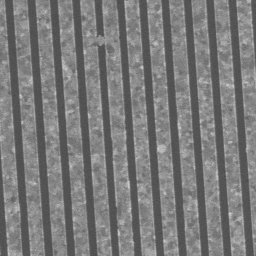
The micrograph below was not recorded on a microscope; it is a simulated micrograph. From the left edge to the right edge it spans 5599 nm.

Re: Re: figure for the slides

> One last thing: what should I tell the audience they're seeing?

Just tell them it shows parallel lines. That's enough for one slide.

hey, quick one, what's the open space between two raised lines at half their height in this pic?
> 188 nm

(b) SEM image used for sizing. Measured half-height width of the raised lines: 284 nanometres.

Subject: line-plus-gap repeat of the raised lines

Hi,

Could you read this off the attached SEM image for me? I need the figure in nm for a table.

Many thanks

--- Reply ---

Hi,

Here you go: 487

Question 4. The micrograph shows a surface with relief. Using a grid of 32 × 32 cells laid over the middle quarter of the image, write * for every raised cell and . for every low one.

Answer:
***..***...***..****..***...***.
***..****..***...***..***...***.
***...***..***...***..***...***.
***...***..***...***..***...***.
***...***..***...***..***...***.
***...***..***...***..***...***.
***...***..****..***..****..***.
***...***..****..***...***..***.
***...***..****..***...***..***.
***...***..****..***...***..***.
.***..***...***..***...***..***.
.***..***...***..***...***..***.
.***..***...***..****..***...***
.***..****..***..****..***...***
.***..***...***..****..***...***
.***..****..***..****..***...***
.***...***..***...***..***...***
.***...***..***...***..***...***
.***...***..***...***..***...***
.***...***..***...***..***...***
.***...***..***...***..***...***
.***...***..****..***..****..***
.***...***..****..***..****..***
.***...***..****..***...***..***
.****..***..****..***...***..***
..***..***...***..***...***..***
..***..***...***..***...***..***
..***..***...***..****..***...**
..***..***...***..****..***...**
..***..***...***..****..***...**
..***...***..***...***..***...**
..***..****..***...***..***...**